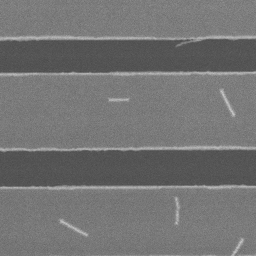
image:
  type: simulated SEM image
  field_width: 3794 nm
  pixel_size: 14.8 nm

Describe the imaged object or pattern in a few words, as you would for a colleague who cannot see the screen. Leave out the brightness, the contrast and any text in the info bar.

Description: lines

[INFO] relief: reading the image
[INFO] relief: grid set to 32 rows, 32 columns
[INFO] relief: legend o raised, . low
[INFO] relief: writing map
oooooooooooooooooooooooooooooooo
oooooooooooooooooooooooooooooooo
oooooooooooooooooooooooooooooooo
oooooooooooooooooooooooooooooooo
oooooooooooooooooooooooooooooooo
................................
................................
................................
................................
oooooooooooooooooooooooooooooooo
oooooooooooooooooooooooooooooooo
oooooooooooooooooooooooooooooooo
oooooooooooooooooooooooooooooooo
oooooooooooooooooooooooooooooooo
oooooooooooooooooooooooooooooooo
oooooooooooooooooooooooooooooooo
oooooooooooooooooooooooooooooooo
oooooooooooooooooooooooooooooooo
oooooooooooooooooooooooooooooooo
................................
................................
................................
................................
oooooooooooooooooooooooooooooooo
oooooooooooooooooooooooooooooooo
oooooooooooooooooooooooooooooooo
oooooooooooooooooooooooooooooooo
oooooooooooooooooooooooooooooooo
oooooooooooooooooooooooooooooooo
oooooooooooooooooooooooooooooooo
oooooooooooooooooooooooooooooooo
oooooooooooooooooooooooooooooooo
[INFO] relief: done